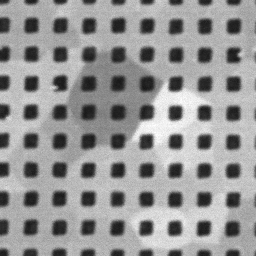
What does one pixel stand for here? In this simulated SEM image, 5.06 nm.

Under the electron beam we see a regular array of holes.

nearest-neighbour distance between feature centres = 28.6 pixels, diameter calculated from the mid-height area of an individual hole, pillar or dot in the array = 16.9 pixels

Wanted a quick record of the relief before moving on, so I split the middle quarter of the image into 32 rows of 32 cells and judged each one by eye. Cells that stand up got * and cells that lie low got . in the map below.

********************************
********************************
********************************
.****...****...****....***....**
.***....****...****....***....**
.***....****...****....***....**
.***....****...****....***...***
********************************
********************************
********************************
.***....****...****...****....**
.***....****...****....***....**
.***....***....****....***....**
.***....****...****...****....**
********************************
********************************
********************************
*****...****...*****..*****...**
.***....****...****....***....**
.***....***....****....***....**
.***....***....****...****....**
************..*****..******..***
********************************
********************************
*******.*****..******.**********
.***....****....***....***....**
.***....***....****....***....**
.***....***....****....***....**
****...*****...****...****...***
********************************
********************************
********************************